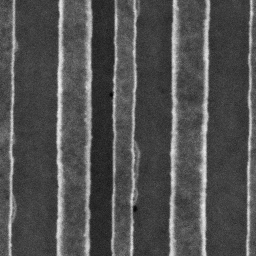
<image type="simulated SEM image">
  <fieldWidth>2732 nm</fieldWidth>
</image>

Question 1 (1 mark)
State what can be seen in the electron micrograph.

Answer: lines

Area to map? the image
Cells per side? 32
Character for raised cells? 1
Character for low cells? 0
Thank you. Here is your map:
11000000111000111000001111000001
11000000111000111000001111000001
11000000111000111000001111000001
11000001111000111000001111000001
11000001111000111000001111000001
11000001111000111000001111000001
11000001111000111000001111000001
11000001111000111000001111000001
11000001111000111000001111000001
11000001111000111000001111000001
11000001111000111000001111000001
11000001111000111000001111000001
11000001111000111000001111000001
11000001111000111000001111000001
11000001111000111000001111000001
11000001111000111000001111000001
11000001111000111000001111000001
10000001111000111000001111000001
10000001111000111000011111000001
10000001111000111000011111000001
11000001111000111000011111000001
11000001111000111000011111000001
10000001111000111000011111000001
10000001111000111000011111000001
10000001111000111000011111000001
10000001111000111000011111000001
10000001111000111000011111000001
10000001111000111000011111000001
10000001111000111000011111000001
10000001111000111000011111000001
10000001111000111000011111000001
10000001111000111000011111000001